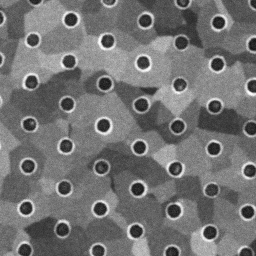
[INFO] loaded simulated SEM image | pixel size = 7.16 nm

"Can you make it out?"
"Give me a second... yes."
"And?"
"a regular array of holes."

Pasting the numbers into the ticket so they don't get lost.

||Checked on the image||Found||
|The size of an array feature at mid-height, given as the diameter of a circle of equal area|0.103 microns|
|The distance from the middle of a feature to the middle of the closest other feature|0.3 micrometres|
